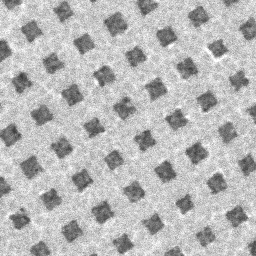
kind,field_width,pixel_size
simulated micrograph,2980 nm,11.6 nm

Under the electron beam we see a regular array of raised bodies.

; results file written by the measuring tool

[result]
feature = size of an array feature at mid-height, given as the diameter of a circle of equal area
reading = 20.9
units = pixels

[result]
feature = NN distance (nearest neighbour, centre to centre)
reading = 428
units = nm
